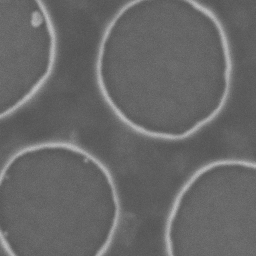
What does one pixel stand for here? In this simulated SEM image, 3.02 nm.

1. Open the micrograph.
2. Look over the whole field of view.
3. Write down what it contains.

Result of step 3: holes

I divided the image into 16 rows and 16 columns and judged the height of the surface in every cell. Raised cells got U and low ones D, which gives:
DDDUUUUUDDDDUUUU
DDDUUUUDDDDDDDUU
DDDUUUUDDDDDDDUU
DDDUUUDDDDDDDDUU
DDDUUUDDDDDDDDUU
DDUUUUDDDDDDDDUU
DUUUUUUDDDDDDDUU
UUUUUUUUDDDDDUUU
UUUUUUUUUUUUUUUU
UUDDDUUUUUUUUUUU
DDDDDDUUUUUUUDDD
DDDDDDDUUUUUDDDD
DDDDDDDUUUUDDDDD
DDDDDDDUUUUDDDDD
DDDDDDDUUUUDDDDD
UDDDDDUUUUUDDDDD